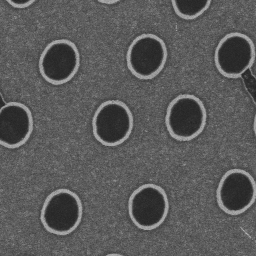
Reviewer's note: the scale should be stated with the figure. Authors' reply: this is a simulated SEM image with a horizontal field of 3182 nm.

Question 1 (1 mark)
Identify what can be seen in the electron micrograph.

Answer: a regular array of raised bodies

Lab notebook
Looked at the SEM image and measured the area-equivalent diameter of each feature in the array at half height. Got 491 nanometres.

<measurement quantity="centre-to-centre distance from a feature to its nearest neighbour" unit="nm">997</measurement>